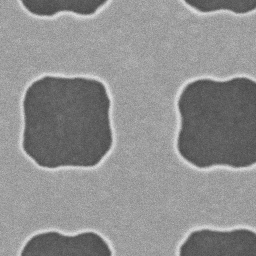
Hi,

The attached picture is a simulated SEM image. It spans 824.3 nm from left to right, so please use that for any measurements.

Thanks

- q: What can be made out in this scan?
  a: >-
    holes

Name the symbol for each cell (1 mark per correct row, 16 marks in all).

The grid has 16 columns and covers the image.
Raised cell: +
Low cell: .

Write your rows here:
++....++++++....
++++++++++++++++
++++++++++++++++
++++++++++++++++
++++++++++++++++
++.....+++++....
+......++++.....
++.....++++.....
+......++++.....
++.....++++.....
++++++++++++++++
++++++++++++++++
++++++++++++++++
++++++++++++++++
+++.++++++++....
+......++++.....